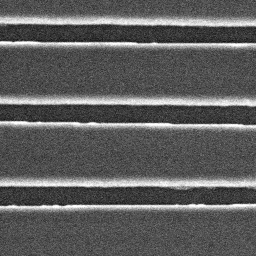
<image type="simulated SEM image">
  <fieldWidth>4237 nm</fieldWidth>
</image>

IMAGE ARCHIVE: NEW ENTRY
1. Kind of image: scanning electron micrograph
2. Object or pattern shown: lines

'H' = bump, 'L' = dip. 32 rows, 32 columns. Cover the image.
HHHHHHHHHHHHHHHHHHHHHHHHHHHHHHHH
HHHHHHHHHHHHHHHHHHHHHHHHHHHHHHHH
HHHHHHHHHHHHHHHHHHHHHHHHHHHHHHHH
LLLLLLLLLLLLLLLLLLLLLLLLLLLLLLLL
LLLLLLLLLLLLLLLLLLLLLLLLLLLLLLLL
HHHHHHHHHHHHHHHHHLLLLLLLLLLLLLLL
HHHHHHHHHHHHHHHHHHHHHHHHHHHHHHHH
HHHHHHHHHHHHHHHHHHHHHHHHHHHHHHHH
HHHHHHHHHHHHHHHHHHHHHHHHHHHHHHHH
HHHHHHHHHHHHHHHHHHHHHHHHHHHHHHHH
HHHHHHHHHHHHHHHHHHHHHHHHHHHHHHHH
HHHHHHHHHHHHHHHHHHHHHHHHHHHHHHHH
HHHHHHHHHHHHHHHHHHHHHHHHHHHHHHHH
LLLLLLLLLLLLLLLLLLLLLLLLLLLLLLLL
LLLLLLLLLLLLLLLLLLLLLLLLLLLLLLLL
HHHHHHHHHHLHLLLLLLLLLLLLLLLLLLLL
HHHHHHHHHHHHHHHHHHHHHHHHHHHHHHHH
HHHHHHHHHHHHHHHHHHHHHHHHHHHHHHHH
HHHHHHHHHHHHHHHHHHHHHHHHHHHHHHHH
HHHHHHHHHHHHHHHHHHHHHHHHHHHHHHHH
HHHHHHHHHHHHHHHHHHHHHHHHHHHHHHHH
HHHHHHHHHHHHHHHHHHHHHHHHHHHHHHHH
HHHHHHHHHHHHHHHHHHHHHHHHHHHHHHHH
LLLLLLLLLLLLLLLLLLLLLLLLLLLLLLLL
LLLLLLLLLLLLLLLLLLLLLLLLLLLLLLLL
LLLLLLLLLLLLLLLLLLLLLLLLLLLLLLLL
HHHHHHHHHHHHHHHHHHHHHHHHHHHHHHHH
HHHHHHHHHHHHHHHHHHHHHHHHHHHHHHHH
HHHHHHHHHHHHHHHHHHHHHHHHHHHHHHHH
HHHHHHHHHHHHHHHHHHHHHHHHHHHHHHHH
HHHHHHHHHHHHHHHHHHHHHHHHHHHHHHHH
HHHHHHHHHHHHHHHHHHHHHHHHHHHHHHHH